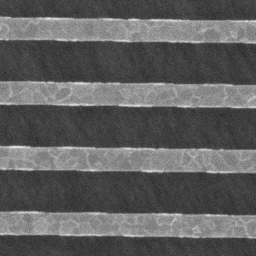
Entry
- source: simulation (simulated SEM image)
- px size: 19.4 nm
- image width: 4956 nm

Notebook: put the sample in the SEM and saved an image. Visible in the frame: lines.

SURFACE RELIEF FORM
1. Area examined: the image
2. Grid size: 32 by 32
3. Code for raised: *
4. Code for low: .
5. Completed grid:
................................
................................
***************.*...............
********************************
********************************
................................
................................
................................
................................
................................
***********...*.................
********************************
********************************
................................
................................
................................
................................
................................
***********.....................
********************************
********************************
..........................******
................................
................................
................................
................................
................................
********************************
********************************
......................**********
................................
................................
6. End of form